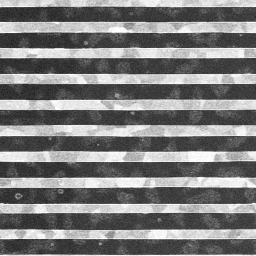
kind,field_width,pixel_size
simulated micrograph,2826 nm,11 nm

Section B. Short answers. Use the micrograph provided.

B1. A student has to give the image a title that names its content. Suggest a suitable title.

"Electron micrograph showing parallel lines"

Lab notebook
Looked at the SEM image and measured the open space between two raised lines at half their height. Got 178 nm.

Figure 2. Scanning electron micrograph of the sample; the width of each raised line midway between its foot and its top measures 0.102 microns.